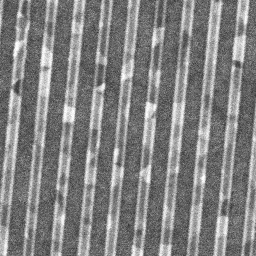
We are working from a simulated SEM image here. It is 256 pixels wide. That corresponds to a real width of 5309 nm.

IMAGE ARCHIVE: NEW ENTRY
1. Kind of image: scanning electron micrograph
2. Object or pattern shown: parallel lines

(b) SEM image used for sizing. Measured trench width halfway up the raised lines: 0.395 microns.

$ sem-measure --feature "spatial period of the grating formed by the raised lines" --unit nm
564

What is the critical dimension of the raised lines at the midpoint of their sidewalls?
0.163 µm